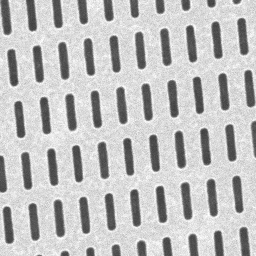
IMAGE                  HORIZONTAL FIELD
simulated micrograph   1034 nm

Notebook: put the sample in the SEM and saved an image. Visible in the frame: a regular array of holes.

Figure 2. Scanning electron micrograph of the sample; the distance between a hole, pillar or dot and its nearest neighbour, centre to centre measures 104 nanometres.